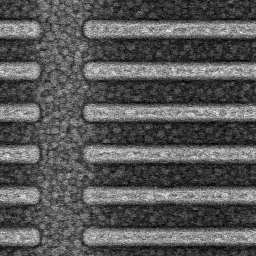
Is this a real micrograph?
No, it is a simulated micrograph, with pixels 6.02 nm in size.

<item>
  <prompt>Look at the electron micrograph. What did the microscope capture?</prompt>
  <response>parallel lines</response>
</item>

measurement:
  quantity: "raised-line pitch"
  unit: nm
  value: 250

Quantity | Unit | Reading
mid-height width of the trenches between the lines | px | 26.9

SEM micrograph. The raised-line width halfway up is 86.5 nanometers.